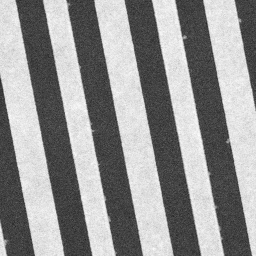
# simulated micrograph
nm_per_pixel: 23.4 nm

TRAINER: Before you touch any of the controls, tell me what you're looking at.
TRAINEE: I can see lines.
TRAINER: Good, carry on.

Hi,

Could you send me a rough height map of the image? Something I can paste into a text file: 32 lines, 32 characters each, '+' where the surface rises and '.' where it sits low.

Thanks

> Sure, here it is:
++...+++....++++...+++...++++...
++....+++...++++...+++....++++..
++....+++...++++....++....++++..
+++...+++...++++....+++...++++..
+++...+++....+++....+++...++++..
+++...+++....++++...+++...++++..
+++....+++...++++...+++....+++..
+++....+++...++++....++....++++.
++++...+++...++++....+++...++++.
++++...+++....+++....+++...++++.
++++...+++....++++...+++...++++.
++++....++....++++...+++....+++.
.+++....+++...++++...+++....++++
.+++....+++...++++....+++...++++
.++++...+++....+++....+++...++++
.++++...+++....++++...+++...++++
.++++....++....++++...+++....+++
..+++....+++...++++...+++....+++
..+++....+++...++++....++....+++
..++++...+++....+++....+++...+++
..++++...+++....+++....+++...+++
..++++....++....++++...+++...+++
...+++....+++...++++...+++....++
...+++....+++...++++....++....++
...++++...+++....+++....++....++
...++++...+++....+++....+++...++
...++++....++....++++...+++...++
....+++....+++...++++...+++....+
....+++....+++...++++....++....+
....++++...+++...++++....++....+
+...++++...+++....+++....+++...+
+...++++...+++....++++...+++...+